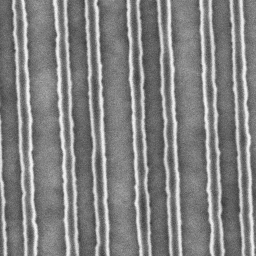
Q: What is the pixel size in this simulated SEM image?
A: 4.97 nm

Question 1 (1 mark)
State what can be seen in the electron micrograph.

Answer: parallel lines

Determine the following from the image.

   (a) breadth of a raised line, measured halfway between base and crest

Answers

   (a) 52.8 nanometers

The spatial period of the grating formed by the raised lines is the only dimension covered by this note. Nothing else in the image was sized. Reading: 180 nm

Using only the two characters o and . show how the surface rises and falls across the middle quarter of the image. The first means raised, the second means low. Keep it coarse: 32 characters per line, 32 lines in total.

o.....ooo........oo.....ooo.....
o.....ooo........ooo....ooo.....
o.....ooo........ooo....ooo.....
o.....ooo........ooo....ooo.....
o.....ooo........ooo.....oo.....
oo....ooo........ooo.....oo.....
oo....ooo........ooo....ooo.....
oo....ooo........ooo.....oo.....
oo.....oo........ooo.....oo.....
oo.....oo........ooo.....oo.....
oo.....oo........ooo.....oo.....
oo.....ooo.......ooo.....oo.....
oo.....ooo.......ooo.....ooo....
oo.....ooo.......ooo.....ooo....
oo.....oo........ooo.....ooo....
oo.....ooo.......ooo.....ooo....
oo.....ooo.......ooo.....ooo....
oo.....ooo.......ooo.....ooo....
oo.....ooo........oo.....ooo....
oo.....ooo........oo.....ooo....
oo......oo........oo......oo....
oo.....ooo........oo.....ooo....
oo.....ooo........oo.....ooo....
ooo....ooo........oo.....ooo....
oo.....ooo........oo.....ooo....
oo.....ooo........ooo.....oo....
oo.....ooo........ooo.....oo....
oo.....ooo........ooo.....oo....
ooo.....oo........ooo.....ooo...
ooo.....oo........oo......ooo...
ooo.....oo........ooo.....oo....
ooo.....oo........ooo.....oo....